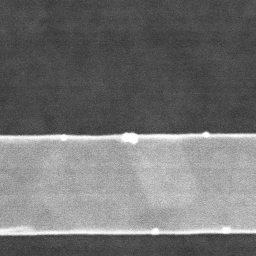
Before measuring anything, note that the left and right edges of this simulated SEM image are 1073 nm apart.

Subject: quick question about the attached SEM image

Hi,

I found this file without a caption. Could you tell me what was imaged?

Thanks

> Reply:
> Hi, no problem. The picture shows wiring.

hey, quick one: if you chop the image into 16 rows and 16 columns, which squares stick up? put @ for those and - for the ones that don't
----------------
----------------
----------------
----------------
----------------
----------------
----------------
----------------
---@---@@@@@@@@@
@@@@@@@@@@@@@@@@
@@@@@@@@@@@@@@@@
@@@@@@@@@@@@@@@@
@@@@@@@@@@@@@@@@
@@@@@@@@@@@@@@@@
@@@@@@@@@@@@@@@@
----------------